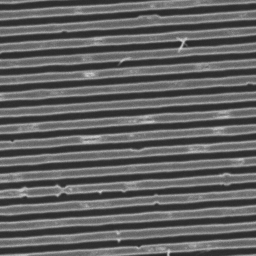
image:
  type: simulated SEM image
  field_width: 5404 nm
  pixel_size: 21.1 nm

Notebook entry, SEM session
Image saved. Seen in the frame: parallel lines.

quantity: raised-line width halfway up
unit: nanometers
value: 200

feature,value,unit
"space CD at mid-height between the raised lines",150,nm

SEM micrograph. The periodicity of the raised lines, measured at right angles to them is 342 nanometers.